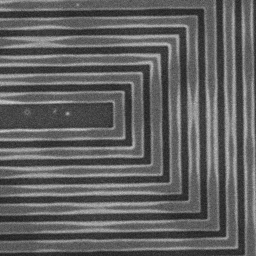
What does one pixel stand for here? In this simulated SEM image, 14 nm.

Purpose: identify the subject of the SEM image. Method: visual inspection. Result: groups of lines, slits or small figures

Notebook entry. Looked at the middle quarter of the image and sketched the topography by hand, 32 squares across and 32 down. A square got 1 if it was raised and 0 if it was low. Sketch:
00000000000000000000001100111001
00000000000000000000001100111001
00000001111111111110001100111001
11111111111111111110001100111001
11111111111111111110001100111001
00000000000000000110001100111001
00000000000000000110001100111001
11111111111111100110001100111001
11111111111111100111001100111001
00000000000011100111001100111001
00000000000001100111001100111001
00000000000001100111001100111000
00000000000001100111001100011000
00000000000001100111001100011000
00000000000001100111001100011001
00000000000011100111001100011001
11111111111111100111001100011001
11111111111111100111001100011001
11111111111111100111001100011001
00000000000000000111001100011001
00000000000000000111001100011001
11111111111111111111001100011001
11111111111111111111001100011001
00000000000000000000001100011000
00000000000000000000001100011000
00000000000000000000111100011000
11111111111111111111111100011001
11111111111111111111111100011001
00000000000000000000000000011001
00000000000000000000000000111001
01111100001111111111111111111001
11111111111111111111111111111001